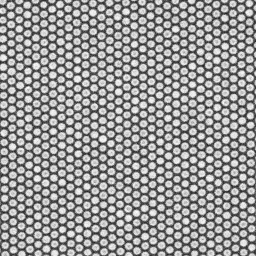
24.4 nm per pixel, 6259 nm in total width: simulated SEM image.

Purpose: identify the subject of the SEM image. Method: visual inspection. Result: a regular array of raised bodies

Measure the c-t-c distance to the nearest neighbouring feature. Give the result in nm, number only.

226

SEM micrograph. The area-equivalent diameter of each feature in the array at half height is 158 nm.